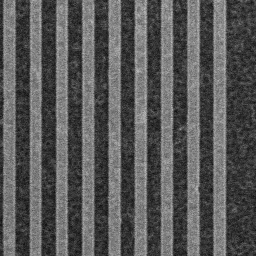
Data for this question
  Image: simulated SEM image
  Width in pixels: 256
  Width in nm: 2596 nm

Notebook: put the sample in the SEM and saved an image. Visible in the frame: parallel lines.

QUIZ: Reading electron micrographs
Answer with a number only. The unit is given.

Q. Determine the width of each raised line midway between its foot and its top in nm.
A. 100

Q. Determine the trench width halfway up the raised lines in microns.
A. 0.165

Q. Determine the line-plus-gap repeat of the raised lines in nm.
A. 266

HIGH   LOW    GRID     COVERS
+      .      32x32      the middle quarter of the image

+....++.....++....++.....++....+
+....++.....++....+++....++....+
+....++.....++....++.....++....+
+....++.....++....++.....++....+
+....++.....++....++.....++....+
+....++.....++....++.....++....+
+....++.....++....++.....++....+
+....++.....++....++.....++....+
+....++.....++....++.....++....+
+....++.....++....++.....++....+
+....++.....++....++.....++....+
+....++.....++....++.....++....+
+....++....+++....++.....++....+
+....++....+++....++.....++....+
+....++....+++....++.....++....+
+....++....+++....++.....++....+
+....++....+++....++.....++....+
+....++....+++....++.....++....+
+....++....+++....++.....++....+
+....++....+++....++.....++....+
+....++....+++....++.....++....+
+....++....+++....++.....++....+
+....++....+++....++.....++....+
+....++....+++....++.....++....+
+....++....+++....++.....++....+
+....++....+++....++.....++....+
+....++....+++....++.....++....+
+....++....+++....++.....++....+
+....++....+++....++.....++....+
+....++....+++....++.....++....+
.....++....+++....++.....++....+
+....++....+++....++.....++....+